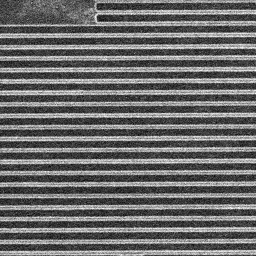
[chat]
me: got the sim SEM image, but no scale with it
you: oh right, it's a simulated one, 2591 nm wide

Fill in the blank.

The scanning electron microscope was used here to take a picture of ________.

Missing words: parallel lines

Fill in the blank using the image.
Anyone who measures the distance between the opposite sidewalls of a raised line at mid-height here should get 34.2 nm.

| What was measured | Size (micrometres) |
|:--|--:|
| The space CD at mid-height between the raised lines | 0.086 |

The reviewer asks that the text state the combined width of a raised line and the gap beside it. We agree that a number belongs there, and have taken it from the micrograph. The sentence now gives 116 nm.